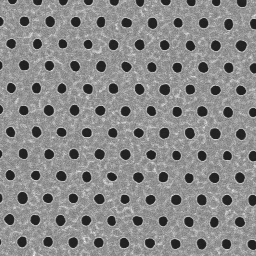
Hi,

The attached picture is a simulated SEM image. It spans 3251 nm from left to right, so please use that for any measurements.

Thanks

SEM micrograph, a regular array of holes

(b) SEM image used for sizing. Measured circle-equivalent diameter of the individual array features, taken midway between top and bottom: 127 nm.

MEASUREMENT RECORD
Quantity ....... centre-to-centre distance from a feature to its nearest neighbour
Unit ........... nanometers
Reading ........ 319